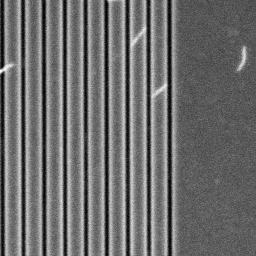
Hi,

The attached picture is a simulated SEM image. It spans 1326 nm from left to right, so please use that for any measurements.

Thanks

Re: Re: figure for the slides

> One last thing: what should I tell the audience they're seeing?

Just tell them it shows parallel lines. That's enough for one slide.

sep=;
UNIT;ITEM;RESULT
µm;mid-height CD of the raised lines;0.0816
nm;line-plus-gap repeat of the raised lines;108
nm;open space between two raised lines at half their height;28.5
